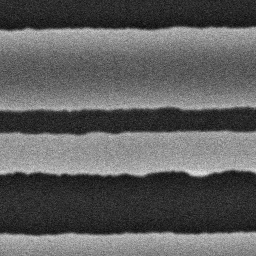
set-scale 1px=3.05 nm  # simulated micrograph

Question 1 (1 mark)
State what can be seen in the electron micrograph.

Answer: lines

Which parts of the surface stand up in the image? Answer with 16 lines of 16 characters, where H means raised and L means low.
LLLLLLLLLLLLLLLL
LLLLLLLLLLLLLLLL
HHHHHHHHHHHHHHHH
HHHHHHHHHHHHHHHH
HHHHHHHHHHHHHHHH
HHHHHHHHHHHHHHHH
HHHHHHHHHHHHHHHH
HHHHHHHHHHHHHHHH
HHHHHHHHHHHHHHHH
HHHHHHHHHHHHHHHH
HHHHHHHHHHHHHHHH
LLLLLLLLLLLLLLLL
LLLLLLLLLLLLLLLL
LLLLLLLLLLLLLLLL
LLLLLLLLLLLLLLLL
HHHHHHHHHHHHHHHH